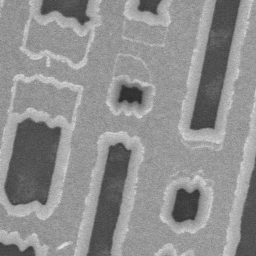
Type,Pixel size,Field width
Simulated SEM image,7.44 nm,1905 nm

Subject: one or a few lines or trenches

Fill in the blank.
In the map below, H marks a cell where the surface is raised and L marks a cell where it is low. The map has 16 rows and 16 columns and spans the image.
HHLLLLHHLLHHHLLH
HHHHHLHHHHHHHLLH
HHHHHHHHHHHHHLLH
HHHHHHHHHHHHHLLH
HHHHHHHHHHHHLLHH
HHHHHHHLLHHHLLHH
HHHHHHHLLHHHLLHH
HLLHHHHHHHHHLLHH
HLLLHHHHHHHHHHHH
LLLLHHHLHHHHHHHH
LLLLHHLLHHHHHHHH
LLLHHHLLHHHHHHHL
LLLHHHLLHHHLLHHL
HHHHHHLLHHHLLHHL
HHHHHLLHHHHHHHHL
LLHHHLLHHHHHHHHL